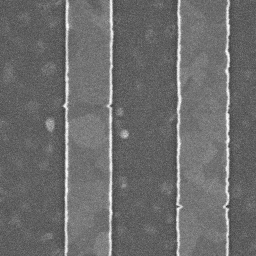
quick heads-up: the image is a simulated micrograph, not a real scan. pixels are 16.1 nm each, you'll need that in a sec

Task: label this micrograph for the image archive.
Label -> one or a few lines or trenches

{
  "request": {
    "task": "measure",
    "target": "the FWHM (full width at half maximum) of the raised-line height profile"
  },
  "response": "754 nanometers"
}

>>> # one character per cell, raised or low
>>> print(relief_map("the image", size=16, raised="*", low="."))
....***....***..
....***....***..
....***....***..
....***....***..
....***....***..
....***....***..
....***....***..
....***....***..
....***....***..
....***....***..
....***....***..
....***....***..
....***....***..
....***....***..
....***....***..
....***....***..